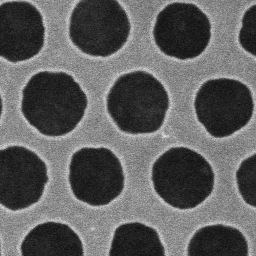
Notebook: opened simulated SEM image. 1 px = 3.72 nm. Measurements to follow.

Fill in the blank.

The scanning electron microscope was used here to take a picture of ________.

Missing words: holes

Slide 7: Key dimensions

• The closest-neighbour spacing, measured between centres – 314 nanometres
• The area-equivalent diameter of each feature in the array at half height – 224 nm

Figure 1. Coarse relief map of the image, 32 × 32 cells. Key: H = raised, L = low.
LLLLHHHHHHLLLLLHHHHHHLLLHHHHHHHH
LLLLLHHHHLLLLLLLHHHHLLLLLHHHHHHL
LLLLLHHHHLLLLLLLHHHHLLLLLLHHHHLL
LLLLLHHHHLLLLLLLHHHLLLLLLLHHHHLL
LLLLLHHHHLLLLLLLHHHLLLLLLLHHHHLL
LLLLLHHHHLLLLLLLHHHHLLLLLLHHHHLL
LLLLLHHHHHLLLLLHHHHHLLLLLHHHHHHL
HLLHHHHHHHHHHHHHHHHHHHHHHHHHHHHH
HHHHHHHHHHHHHHHHHHHHHHHHHHHHHHHH
HHHHLLLLLHHHHHHLLLLHHHHHHHHHHHHH
HHHLLLLLLLHHHHLLLLLLHHHHHLLLLLHH
HHHLLLLLLLHHHHLLLLLLLHHHHLLLLLLH
HHHLLLLLLLLHHLLLLLLLLHHHLLLLLLLL
HHHLLLLLLLLHHLLLLLLLLHHHLLLLLLLL
HHHLLLLLLLHHHHLLLLLLLHHHHLLLLLLH
HHHHLLLLLLHHHHHLLLLLHHHHHLLLLLLH
HHHHHLLLLHHHHHHHLLLHHHHHHHLLLHHH
HHHHHHHHHHHHHHHHHHHHHHHHHHHHHHHH
HLLHHHHHHHLLLHHHHHHHHLLHHHHHHHHH
LLLLLHHHHLLLLLHHHHHHLLLLLHHHHHHL
LLLLLLHHHLLLLLLHHHHLLLLLLLHHHHLL
LLLLLLHHHLLLLLLHHHHLLLLLLLLHHHLL
LLLLLLHHHLLLLLLLHHHLLLLLLLLHHHLL
LLLLLHHHHLLLLLLHHHHLLLLLLLLHHHLL
LLLLLHHHHLLLLLLHHHHHLLLLLLHHHHLL
LLLLHHHHHHHLLHHHHHHHHLLLLHHHHHHL
HHHHHHHHHHHHHHHHHHHHHHHHHHHHHHHH
HHHHHHHHHHHHHHHHHHHHHHHHHHHHHHHH
HHHHLLLLLHHHHHHLLLLHHHHHHLLLLHHH
HHHLLLLLLLHHHHLLLLLLHHHHLLLLLLHH
HHHLLLLLLLHHHHLLLLLLHHHHLLLLLLLH
HHHLLLLLLLHHHHLLLLLLLHHLLLLLLLLH